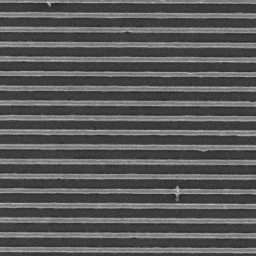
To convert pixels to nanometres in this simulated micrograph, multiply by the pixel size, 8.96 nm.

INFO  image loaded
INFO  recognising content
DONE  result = parallel lines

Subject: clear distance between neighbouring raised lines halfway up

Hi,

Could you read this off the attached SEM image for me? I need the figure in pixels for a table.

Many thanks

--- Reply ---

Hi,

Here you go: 9.88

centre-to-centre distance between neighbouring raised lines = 131 nm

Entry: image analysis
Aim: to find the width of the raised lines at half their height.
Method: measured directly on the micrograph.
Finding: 43.7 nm